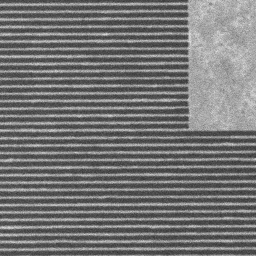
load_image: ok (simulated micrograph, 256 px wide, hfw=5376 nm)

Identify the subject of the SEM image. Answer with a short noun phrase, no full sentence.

parallel lines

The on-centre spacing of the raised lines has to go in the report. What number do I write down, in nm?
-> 156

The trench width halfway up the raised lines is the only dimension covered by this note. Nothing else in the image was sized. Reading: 0.123 um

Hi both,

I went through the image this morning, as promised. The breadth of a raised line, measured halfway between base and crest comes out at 36.8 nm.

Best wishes